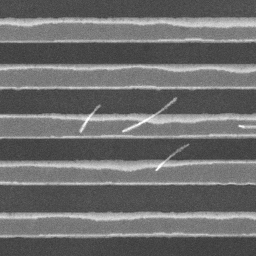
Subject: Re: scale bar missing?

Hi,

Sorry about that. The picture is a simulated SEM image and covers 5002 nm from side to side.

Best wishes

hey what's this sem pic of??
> lines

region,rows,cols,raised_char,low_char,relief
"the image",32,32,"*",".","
................................
................................
.....*************.***..........
********************************
********************************
................................
................................
................................
********************************
********************************
********************************
................................
................................
................................
**********.*....*...........**..
********************************
********************************
................................
................................
................................
***********.**...***************
********************************
********************************
................................
................................
................................
................................
********************************
********************************
********........................
................................
................................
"